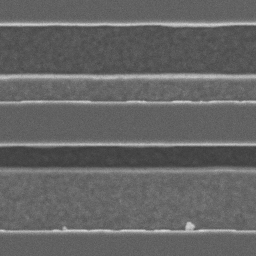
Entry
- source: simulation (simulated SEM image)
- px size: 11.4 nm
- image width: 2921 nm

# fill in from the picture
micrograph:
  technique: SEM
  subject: lines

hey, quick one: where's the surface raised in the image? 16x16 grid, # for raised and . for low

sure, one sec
################
#########.#####.
................
................
................
################
################
################
################
................
................
################
################
################
################
################